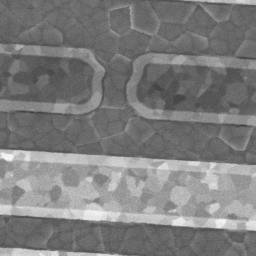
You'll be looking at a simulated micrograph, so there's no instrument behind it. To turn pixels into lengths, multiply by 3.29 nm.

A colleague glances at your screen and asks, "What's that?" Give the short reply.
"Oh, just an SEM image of one or a few lines or trenches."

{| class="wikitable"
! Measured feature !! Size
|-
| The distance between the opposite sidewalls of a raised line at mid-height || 186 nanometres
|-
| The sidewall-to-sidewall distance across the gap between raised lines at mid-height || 0.159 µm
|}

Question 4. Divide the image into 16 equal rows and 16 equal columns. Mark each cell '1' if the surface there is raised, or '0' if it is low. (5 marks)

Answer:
0000000000000000
0000000000000000
0000000000000000
1111100000000000
1111110001111111
1111110011111111
1111110011111111
0000000000000001
0000000000000000
0000000000000000
1111111111111100
1111111111111111
1111111111111111
0000001111111111
0000000000000000
0000000000000000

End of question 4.